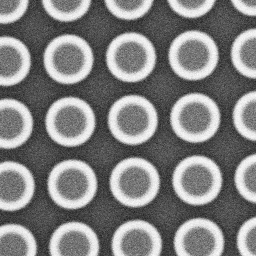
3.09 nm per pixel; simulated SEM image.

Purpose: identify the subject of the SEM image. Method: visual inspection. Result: an array of small figures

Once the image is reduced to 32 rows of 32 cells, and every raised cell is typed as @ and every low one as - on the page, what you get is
@@@--@@@@@@--@@@@@@--@@@@@@--@@@
@@@---@@@@@---@@@@----@@@@----@@
@@-----@@-----------------------
--------------------------------
--------@------@@@----@@@@----@@
@@@---@@@@@---@@@@@---@@@@@--@@@
@@@@--@@@@@--@@@@@@--@@@@@@--@@@
@@@@--@@@@@@-@@@@@@--@@@@@@--@@@
@@@@--@@@@@---@@@@@---@@@@@---@@
@@@---@@@@@---@@@@----@@@@-----@
@@------------------------------
--------------------------------
@@-----@@@-----@@@----@@@@----@@
@@@---@@@@@---@@@@@---@@@@@--@@@
@@@@--@@@@@@--@@@@@@-@@@@@@--@@@
@@@@--@@@@@@--@@@@@@-@@@@@@--@@@
@@@@--@@@@@@--@@@@@---@@@@@---@@
@@@----@@@@----@@@-----@@@------
@-------------------------------
-------------------------------@
@@-----@@@@----@@@@---@@@@@---@@
@@@@--@@@@@@--@@@@@@--@@@@@---@@
@@@@--@@@@@@--@@@@@@--@@@@@@-@@@
@@@@--@@@@@@--@@@@@@--@@@@@@--@@
@@@@--@@@@@@--@@@@@---@@@@@---@@
@@@----@@@@----@@@------@-------
--------------------------------
------------------------@@-----@
@@@----@@@@----@@@@---@@@@@---@@
@@@@---@@@@@--@@@@@@--@@@@@@--@@
@@@@--@@@@@@--@@@@@@--@@@@@@--@@
@@@@--@@@@@@--@@@@@@--@@@@@@--@@